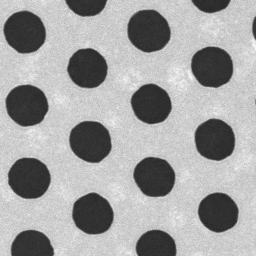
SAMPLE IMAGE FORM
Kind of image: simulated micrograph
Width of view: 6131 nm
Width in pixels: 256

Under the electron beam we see a regular array of holes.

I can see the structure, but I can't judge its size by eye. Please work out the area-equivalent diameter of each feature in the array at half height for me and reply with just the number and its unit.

1010 nm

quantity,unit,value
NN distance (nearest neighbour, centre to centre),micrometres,1.71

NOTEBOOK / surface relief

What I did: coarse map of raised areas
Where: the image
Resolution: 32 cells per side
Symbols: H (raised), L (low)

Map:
HHHHHHHHLLLLLHHHHHHHHHHHLLLLLHHH
HHLLHHHHHLLLLHHHHLLLHHHHHLLHHHHH
HLLLLHHHHHHHHHHHLLLLLHHHHHHHHHHH
LLLLLLHHHHHHHHHHLLLLLHHHHHHHHHHL
HLLLLLHHHHHHHHHHLLLLLHHHHHHHHHHH
HLLLLHHHHHHHHHHHHLLLLHHHHHHHHHHH
HHLLHHHHHLLLHHHHHHLHHHHHHLLLHHHH
HHHHHHHHHLLLLHHHHHHHHHHHLLLLLHHH
HHHHHHHHLLLLLHHHHHHHHHHHLLLLLHHH
HHHHHHHHHLLLLHHHHHHHHHHHLLLLLHHH
HHHHHHHHHLLLLHHHHHLHHHHHHLLLHHHH
HLLLLHHHHHHHHHHHHLLLLHHHHHHHHHHH
HLLLLLHHHHHHHHHHLLLLLHHHHHHHHHHH
HLLLLLHHHHHHHHHHLLLLLHHHHHHHHHHH
HLLLLLHHHHHHHHHHHLLLLHHHHHHHHHHH
HHLLLHHHHHLLLHHHHHHHHHHHHLLLHHHH
HHHHHHHHHLLLLLHHHHHHHHHHLLLLLHHH
HHHHHHHHHLLLLLHHHHHHHHHHLLLLLHHH
HHHHHHHHHLLLLLHHHHHHHHHHHLLLLHHH
HHHHHHHHHHLLLHHHHHHHHHHHHLLLLHHH
HHLLLLHHHHHHHHHHHLLLLHHHHHHHHHHH
HLLLLLHHHHHHHHHHHLLLLLHHHHHHHHHH
HLLLLLHHHHHHHHHHHLLLLLHHHHHHHHHH
HLLLLLHHHHHHHHHHHLLLLLHHHHHHHHHH
HHLLLHHHHHLLLHHHHHLLLHHHHHLLLHHH
HHHHHHHHHLLLLLHHHHHHHHHHHLLLLHHH
HHHHHHHHHLLLLLHHHHHHHHHHHLLLLLHH
HHHHHHHHHLLLLLHHHHHHHHHHHLLLLLHH
HHHHHHHHHHLLLLHHHHHHHHHHHHLLLHHH
HHLLLLHHHHHHHHHHHHLLLHHHHHHHHHHH
HLLLLLHHHHHHHHHHHLLLLLHHHHHHHHHH
HLLLLLLHHHHHHHHHHLLLLLHHHHHHHHHH